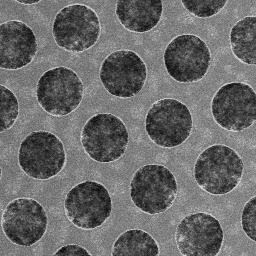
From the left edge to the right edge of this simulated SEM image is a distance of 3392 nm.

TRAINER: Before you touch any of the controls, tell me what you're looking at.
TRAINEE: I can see a regular array of holes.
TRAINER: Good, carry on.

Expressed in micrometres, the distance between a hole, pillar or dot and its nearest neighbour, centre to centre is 0.868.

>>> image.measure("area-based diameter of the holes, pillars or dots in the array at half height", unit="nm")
633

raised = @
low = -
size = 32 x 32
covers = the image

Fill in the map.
@@@-@@@@@@@@@@@-----@@@-----@@@@
@@@@@@@-----@@------@@@@---@@@@@
@@@@@@@-----@@@-----@@@@@@@@@@--
----@@@-----@@@@---@@@@@@@@@@---
----@@@-----@@@@@@@@@@---@@@@---
-----@@-----@@@@@@@@@-----@@@---
-----@@@@-@@@@---@@@@-----@@@---
----@@@@@@@@@-----@@@-----@@@@--
--@@@@@-@@@@@-----@@@-----@@@@@@
@@@@@-----@@@-----@@@----@@@@@@@
@@@@@-----@@@-----@@@@@@@@@@---@
-@@@@-----@@@@---@@@@@@@@@@-----
--@@@-----@@@@@@@@@@--@@@@@-----
--@@@-----@@@@@@@@@----@@@------
--@@@@@@@@@@--@@@@------@@@-----
--@@@@@@@@@----@@@------@@@-----
@@@@--@@@@------@@------@@@@@@@@
@@@----@@@------@@@----@@@@@@@@@
@@------@@------@@@@@@@@@@---@@@
@@------@@@----@@@@@@@@@@-----@@
@@------@@@@@@@@@@@@@@@@------@@
@@@----@@@@@@@@@@----@@@------@@
@@@@@@@@@@@@@@@@------@@@-----@@
@@@@@@@@@----@@@------@@@----@@@
@@@@@@@@------@@------@@@@@@@@@@
@----@@@------@@@----@@@@@@@@@@-
------@@------@@@@--@@@@@@@@@@--
------@@@----@@@@@@@@@@----@@@--
------@@@@--@@@@@@@@@@------@@--
@----@@@@@@@@@@----@@@------@@@-
@@--@@@@@@@@@@------@@------@@@@
@@@@@@@----@@@------@@@----@@@@@